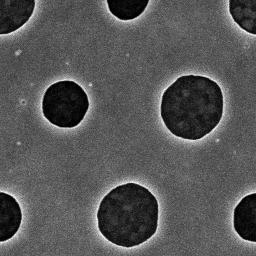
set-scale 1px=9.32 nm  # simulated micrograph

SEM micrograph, holes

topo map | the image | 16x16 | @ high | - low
--@@@@@--@@@@@--
-@@@@@@@@@@@@@@-
@@@@@@@@@@@@@@@@
@@@@@@@@@@@@@@@@
@@@@@@@@@@@@@@@@
@@@--@@@@@@---@@
@@@---@@@@----@@
@@@--@@@@@----@@
@@@@@@@@@@@--@@@
@@@@@@@@@@@@@@@@
@@@@@@@@@@@@@@@@
@@@@@@@@@@@@@@@@
-@@@@@----@@@@@-
-@@@@@----@@@@@-
-@@@@@----@@@@@-
@@@@@@@@@@@@@@@@